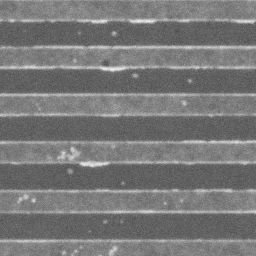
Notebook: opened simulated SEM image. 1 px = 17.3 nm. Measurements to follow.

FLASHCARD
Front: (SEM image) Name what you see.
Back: lines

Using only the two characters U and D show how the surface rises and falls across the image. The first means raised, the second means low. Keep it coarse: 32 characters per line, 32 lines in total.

UUUUUUUUUUUUUUUUUUUUUUUUUUUUUUUU
UUUUUUUUUUUUUUUUUUUUUUUUUUUUUUUU
UUUUUUUUUUUUUUUUUUUUUUUUUUUUUUUU
DDDDDDDDDDDDDDDDDDDDDDDDDDDDDDDD
DDDDDDDDDDDDDDDDDDDDDDDDDDDDDDDD
DDDDDDDDDDDDDDDDDDDDDDDDDDDDDDDD
UUUUUUUUUUUUUUUUUUUUUUUUUUUUUUUU
UUUUUUUUUUUUUUUUUUUUUUUUUUUUUUUU
DDDDDDDDDDDDDUUDDDDDDDDDDDDDDDDD
DDDDDDDDDDDDDDDDDDDDDDDDDDDDDDDD
DDDDDDDDDDDDDDDDDDDDDDDDDDDDDDDD
DDDDDDDDDDDDDDDDDDDDDDDDDDDDDDDD
UUUUUUUUUUUUUUUUUUUUUUUUUUUUUUUU
UUUUUUUUUUUUUUUUUUUUUUUUUUUUUUUU
DDDDDDDDDDDDDDDDDDDDDDDDDDDDDDDD
DDDDDDDDDDDDDDDDDDDDDDDDDDDDDDDD
DDDDDDDDDDDDDDDDDDDDDDDDDDDDDDDD
DDDDDDDDDDDDDDDDDDDDDDDDDDDDDDDD
UUUUUUUUUUUUUUUUUUUUUUUUUUUUUUUU
UUUUUUUUUUUUUUUUUUUUUUUUUUUUUUUU
DDDDDDDDDDDUDDDDDDDDDDDDDDDDDDDD
DDDDDDDDDDDDDDDDDDDDDDDDDDDDDDDD
DDDDDDDDDDDDDDDDDDDDDDDDDDDDDDDD
DDDDDDDDDDDDDDDDDDDDDDDDDDDDDDDD
UUUUUUUUUUUUUUUUUUUUUUUUUUUUUUUU
UUUUUUUUUUUUUUUUUUUUUUUUUUUUUUUU
UUUUUUUUUUUUUUUUUUUUUUUUUUUUUUUU
DDDDDDDDDDDDDDDDDDDDDDDDDDDDDDDD
DDDDDDDDDDDDDDDDDDDDDDDDDDDDDDDD
DDDDDDDDDDDDDDDDDDDDDDDDDDDDDDDD
UUUUUUUUUUUUUUUUUUUUUUUUUUUUUUUU
UUUUUUUUUUUUUUUUUUUUUUUUUUUUUUUU